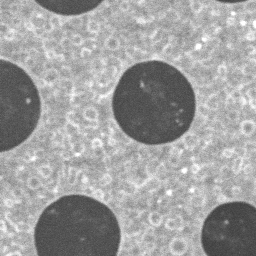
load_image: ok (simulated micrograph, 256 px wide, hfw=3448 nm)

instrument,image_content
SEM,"holes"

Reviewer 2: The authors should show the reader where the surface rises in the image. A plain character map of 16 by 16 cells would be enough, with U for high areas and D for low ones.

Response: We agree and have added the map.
UUUDDDUUUUUUUUUU
UUUUUUUUUUUUUUUU
UUUUUUUUUUUUUUUU
UUUUUUUUUUUUUUUU
DDUUUUUUDDDUUUUU
DDUUUUUDDDDDUUUU
DDDUUUUDDDDDUUUU
DDUUUUUDDDDDUUUU
DDUUUUUUDDDUUUUU
UUUUUUUUUUUUUUUU
UUUUUUUUUUUUUUUU
UUUUUUUUUUUUUUUU
UUUUDDUUUUUUUUUU
UUDDDDDUUUUUUDDD
UUDDDDDDUUUUUDDD
UUDDDDDUUUUUUDDD